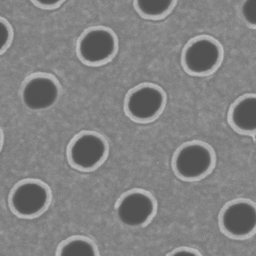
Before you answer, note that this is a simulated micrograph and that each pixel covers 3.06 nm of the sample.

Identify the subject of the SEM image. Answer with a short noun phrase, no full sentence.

a regular array of holes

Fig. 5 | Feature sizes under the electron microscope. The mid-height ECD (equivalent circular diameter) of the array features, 91.3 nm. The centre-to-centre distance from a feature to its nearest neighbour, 74.5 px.